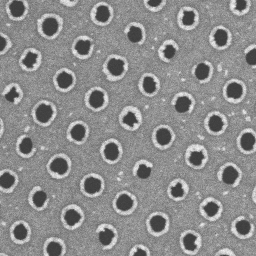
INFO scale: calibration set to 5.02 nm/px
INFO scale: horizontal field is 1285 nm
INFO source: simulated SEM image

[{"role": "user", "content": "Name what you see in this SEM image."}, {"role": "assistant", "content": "a regular array of holes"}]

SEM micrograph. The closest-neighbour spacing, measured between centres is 188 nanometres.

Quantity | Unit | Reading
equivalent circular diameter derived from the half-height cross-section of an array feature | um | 0.0785